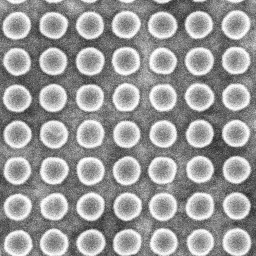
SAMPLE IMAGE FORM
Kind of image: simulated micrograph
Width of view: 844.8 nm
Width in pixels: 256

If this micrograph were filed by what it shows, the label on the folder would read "a regular array of raised bodies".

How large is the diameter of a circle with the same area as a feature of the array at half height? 85.5 nanometers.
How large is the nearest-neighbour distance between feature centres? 119 nm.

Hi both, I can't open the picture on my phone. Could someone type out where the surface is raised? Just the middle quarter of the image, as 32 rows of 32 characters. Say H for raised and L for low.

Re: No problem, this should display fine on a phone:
LLLHHHHHHLLLLHHHHHHLLLHHHHHHLLLH
LLLLHHHHHLLLLHHHHHLLLLLHHHHLLLLL
LLLLLLHHLLLLLLLLLLLLLLLLLLLLLLLL
LLLLLLLLLLLLLLLLLLLLLLLLLLLLLLLL
LLLLLLLLLLLLLLLLLLLLLLLLLLLLLLLL
LLLLLLHHLLLLLLHHHLLLLLLLLHLLLLLL
LLLLHHHHHLLLLHHHHHLLLLHHHHHLLLLH
LLLHHHHHHHLLLHHHHHHLLLHHHHHHLLLH
LLLHHHHHHHLLHHHHHHHLLLHHHHHHLLHH
LLLHHHHHHHLLLHHHHHHLLLHHHHHHLLLH
LLLLHHHHHLLLLHHHHHLLLLLHHHHLLLLL
LLLLLHHHLLLLLLLLLLLLLLLLLLLLLLLL
LLLLLLLLLLLLLLLLLLLLLLLLLLLLLLLL
LLLLLLLLLLLLLLLLLLLLLLLLLLLLLLLL
LLLLLHHHLLLLLLLLLLLLLLLLHHLLLLLL
LLLLHHHHHLLLLHHHHHLLLLHHHHHLLLLL
LLLLHHHHHHLLLHHHHHHLLLHHHHHHLLLH
HLLHHHHHHHLLLHHHHHHLLLHHHHHHLLLH
HLLHHHHHHLLLLHHHHHHLLLHHHHHHLLLH
LLLLHHHHHLLLLHHHHHLLLLHHHHHLLLLH
LLLLLHHHLLLLLLLHHLLLLLLLHHLLLLLL
LLLLLLLLLLLLLLLLLLLLLLLLLLLLLLLL
LLLLLLLLLLLLLLLLLLLLLLLLLLLLLLLL
LLLLLLLLLLLLLLLHHLLLLLLLLLLLLLLL
LLLLHHHHHLLLLHHHHHLLLLHHHHHLLLLH
HLLLHHHHHHLLLHHHHHHLLHHHHHHHLLLH
HLLLHHHHHHLLHHHHHHHLLHHHHHHHLLLH
HLLLHHHHHHLLLHHHHHHLLHHHHHHHLLLH
LLLLHHHHHLLLLHHHHHLLLLHHHHHLLLLL
LLLLLHHHLLLLLLHHHLLLLLLHHLLLLLLL
LLLLLLLLLLLLLLLLLLLLLLLLLLLLLLLL
LLLLLLLLLLLLLLLLLLLLLLLLLLLLLLLL